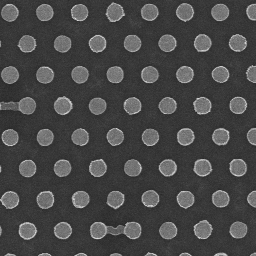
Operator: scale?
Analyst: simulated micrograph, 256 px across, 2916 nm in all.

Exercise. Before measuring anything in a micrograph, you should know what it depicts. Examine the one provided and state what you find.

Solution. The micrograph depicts a regular array of raised bodies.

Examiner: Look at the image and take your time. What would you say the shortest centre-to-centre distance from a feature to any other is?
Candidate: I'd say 397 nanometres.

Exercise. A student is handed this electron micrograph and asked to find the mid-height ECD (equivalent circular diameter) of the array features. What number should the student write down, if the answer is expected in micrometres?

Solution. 0.198